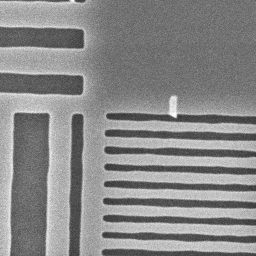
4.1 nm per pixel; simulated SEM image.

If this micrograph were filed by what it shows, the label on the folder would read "groups of lines, slits or small figures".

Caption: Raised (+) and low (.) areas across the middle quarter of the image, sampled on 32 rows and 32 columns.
++++++++++++++++++++++++++++++++
++++++++++++++++++++++++++++++++
.+++++++++++++++++++++++++++++++
.....+++++++++++++++++++++++++++
.....+++++++++++++++++++++++++++
.....+++++++++++++++++++++++++++
.....+++++++++++++++++++++++++++
....++++++++++++++++++++++++++++
++++++++++++++++++++++++++++++++
++++++++++++++++++++++++++++++++
++++++++++++++++++++++++++++++++
++++++++++++++++++++++++++++++++
++..+++++++...............++...+
++...++++++.....................
++...++++++++++++++++++++.......
++...+++++++++++++++++++++++++++
++...++++++..........+++++++++++
++...+++++......................
++...+++++++++..................
++...+++++++++++++++++++++++++++
++...++++++.++++++++++++++++++++
++...+++++......................
++...++++++.....................
+....+++++++++++++++++++++++++++
+....+++++++++++++++++++++++++++
+....+++++......................
+....+++++......................
+....+++++++++++++++++++++++++++
+....+++++++++++++++++++++++++++
+....+++++............++++++++++
+....+++++......................
+....++++++++++++++++++++++++...